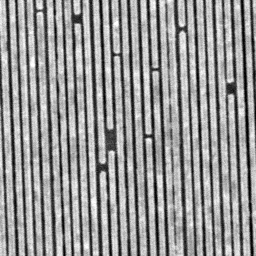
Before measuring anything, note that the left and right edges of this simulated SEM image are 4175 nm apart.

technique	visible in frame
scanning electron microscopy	parallel lines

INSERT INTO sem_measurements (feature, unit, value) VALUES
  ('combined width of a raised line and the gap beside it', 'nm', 153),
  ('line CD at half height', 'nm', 91.7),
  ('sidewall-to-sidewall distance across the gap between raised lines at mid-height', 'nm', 61.1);